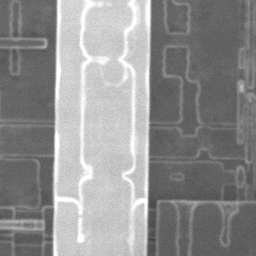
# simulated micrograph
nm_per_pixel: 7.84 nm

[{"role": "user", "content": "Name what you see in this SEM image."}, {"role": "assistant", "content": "wiring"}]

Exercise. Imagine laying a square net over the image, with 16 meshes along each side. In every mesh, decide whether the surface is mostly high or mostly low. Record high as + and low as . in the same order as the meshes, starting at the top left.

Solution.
....+++++.......
....+++++.......
++..+++++.......
....+++++.......
....+++++.......
....+++++.......
....+++++.......
....+++++.......
....+++++.......
....+++++.......
...++++++.......
...++++++.......
...++++++.......
...++++++.++++++
...++++++.++++++
...++++++.++++++